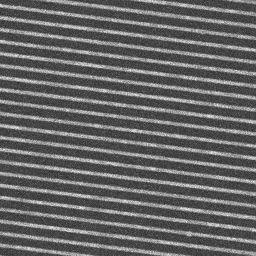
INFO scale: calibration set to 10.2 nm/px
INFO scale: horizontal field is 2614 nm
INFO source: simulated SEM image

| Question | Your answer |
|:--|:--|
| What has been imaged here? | parallel lines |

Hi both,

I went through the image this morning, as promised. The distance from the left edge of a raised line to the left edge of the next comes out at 121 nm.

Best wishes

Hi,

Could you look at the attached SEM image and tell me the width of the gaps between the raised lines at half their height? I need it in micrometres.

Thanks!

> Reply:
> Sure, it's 0.0887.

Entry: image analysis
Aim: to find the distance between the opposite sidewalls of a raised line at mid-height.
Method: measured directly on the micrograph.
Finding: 26.6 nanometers